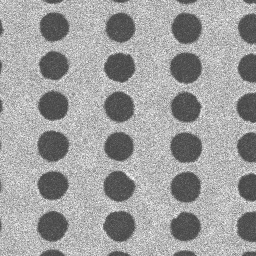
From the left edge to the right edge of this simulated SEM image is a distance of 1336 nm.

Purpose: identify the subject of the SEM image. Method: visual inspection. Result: a regular array of holes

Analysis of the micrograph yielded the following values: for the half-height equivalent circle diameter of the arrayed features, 158 nanometers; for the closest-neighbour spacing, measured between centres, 0.206 micrometres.